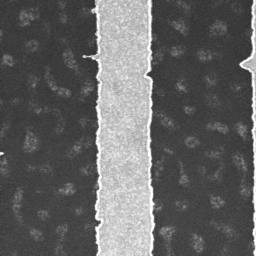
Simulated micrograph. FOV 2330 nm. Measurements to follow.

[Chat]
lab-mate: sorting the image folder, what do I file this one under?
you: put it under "one or a few lines or trenches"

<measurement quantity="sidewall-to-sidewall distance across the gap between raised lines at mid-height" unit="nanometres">938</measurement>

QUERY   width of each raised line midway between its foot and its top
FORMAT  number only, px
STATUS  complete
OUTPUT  51.6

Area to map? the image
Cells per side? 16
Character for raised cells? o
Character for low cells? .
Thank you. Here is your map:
......ooo.......
......ooo.......
......ooo.......
......ooo.......
......ooo.......
......ooo.......
......ooo.......
......ooo.......
......ooo.......
......ooo.......
......ooo.......
......ooo.......
......ooo.......
......ooo.......
......oooo......
......ooo.......